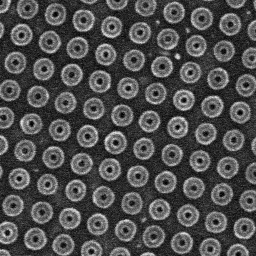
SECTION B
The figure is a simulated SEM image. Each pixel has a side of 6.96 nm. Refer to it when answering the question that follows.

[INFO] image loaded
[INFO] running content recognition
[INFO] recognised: a regular array of ring-shaped raised bodies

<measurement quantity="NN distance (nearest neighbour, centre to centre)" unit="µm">0.193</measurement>